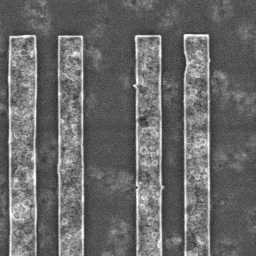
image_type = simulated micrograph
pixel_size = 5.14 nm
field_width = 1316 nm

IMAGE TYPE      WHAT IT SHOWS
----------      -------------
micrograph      one or a few lines or trenches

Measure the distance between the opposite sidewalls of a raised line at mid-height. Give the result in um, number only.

0.121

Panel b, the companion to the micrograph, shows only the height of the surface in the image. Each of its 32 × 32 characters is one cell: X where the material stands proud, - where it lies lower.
--------------------------------
--------------------------------
--------------------------------
--------------------------------
------------------------XX------
-XXX---XXX-------XXX---XXX------
-XXX---XXX-------XXX---XXX------
-XXX---XXX-------XXX---XXX------
-XXX---XXX-------XXX---XXX------
-XXX---XXX-------XXX---XXX------
-XXX---XXX-------XXX---XXX------
-XXX---XXX-------XXX---XXX------
-XXX---XXX-------XXX---XXX------
-XXX---XXX-------XXX---XXX------
-XXX---XXX-------XXX---XXX------
-XXX---XXX-------XXX---XXX------
-XXX---XXX-------XXX---XXX------
-XXX---XXX-------XXX---XXX------
-XXX---XXX-------XXX---XXX------
-XXX---XXX-------XXX---XXX------
-XXX---XXX-------XXX---XXX------
-XXX---XXX-------XXX---XXX------
-XXX---XXX-------XXX---XXX------
-XXX---XXX-------XXX---XXX------
-XXX---XXX-------XXX---XXX------
-XXX---XXX-------XXX---XXX------
-XXX---XXX-------XXX---XXX------
-XXX---XXX-------XXX---XXX------
-XXX----XX-------XXX---XXX------
-XXX----XX-------XXX---XXX------
-XXX----XX-------XXX---XXX------
-XXX----XX-------XXX---XXX------